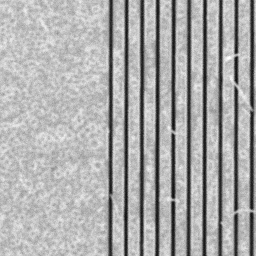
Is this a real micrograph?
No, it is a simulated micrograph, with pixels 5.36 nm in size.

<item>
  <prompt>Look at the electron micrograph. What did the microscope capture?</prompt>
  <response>parallel lines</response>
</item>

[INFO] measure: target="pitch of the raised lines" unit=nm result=84.2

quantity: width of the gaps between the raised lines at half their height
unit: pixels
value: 4.25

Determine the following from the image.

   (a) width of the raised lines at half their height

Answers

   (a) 11 px